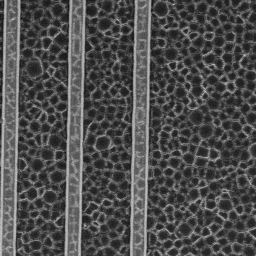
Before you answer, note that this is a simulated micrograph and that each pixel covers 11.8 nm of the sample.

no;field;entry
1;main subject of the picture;one or a few lines or trenches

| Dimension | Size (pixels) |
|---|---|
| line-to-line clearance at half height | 51.8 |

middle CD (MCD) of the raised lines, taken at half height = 157 nm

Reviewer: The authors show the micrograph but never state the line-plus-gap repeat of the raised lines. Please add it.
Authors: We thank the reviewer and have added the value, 767 nanometers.